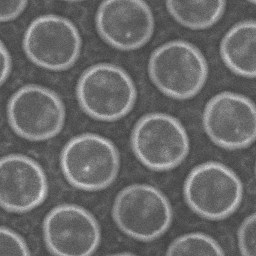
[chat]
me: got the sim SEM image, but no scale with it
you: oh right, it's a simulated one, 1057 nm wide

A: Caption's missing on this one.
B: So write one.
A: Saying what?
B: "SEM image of a regular array of raised bodies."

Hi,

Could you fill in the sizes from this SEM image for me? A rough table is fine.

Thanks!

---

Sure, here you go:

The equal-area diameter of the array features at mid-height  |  0.224 micrometres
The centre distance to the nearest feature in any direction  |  299 nanometers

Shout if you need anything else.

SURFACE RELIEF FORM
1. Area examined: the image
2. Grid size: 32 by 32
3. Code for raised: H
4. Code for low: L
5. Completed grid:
HHHLLLLLLLLLLHHHHHLLLHHHHHHHLLLL
HHLLLLLLLLLLHHHHHHHLLHHHHHHHLLLL
LLLLLHHHLLLLHHHHHHHLLLHHHHHLLLLL
LLLLHHHHHLLLHHHHHHHLLLLLLLLLLHHH
LLLHHHHHHHLLLHHHHHHLLLLLLLLLHHHH
LLLHHHHHHHLLLLHHHHLLLHHLLLLLHHHH
HLLHHHHHHHLLLLLLLLLHHHHHHLLLHHHH
HLLLHHHHHLLLLLLLLLLHHHHHHLLLHHHH
HLLLLLHHLLLLHHLLLLLHHHHHHHLLLHHH
HLLLLLLLLLHHHHHHLLLHHHHHHHLLLLLL
LLLLLLLLLLHHHHHHLLLLHHHHHLLLLLLL
LLHHHHLLLLHHHHHHHLLLLHHHLLLLLLLL
LHHHHHHLLLHHHHHHHLLLLLLLLLLHHHHL
LHHHHHHHLLLHHHHHLLLLLLLLLLHHHHHH
LHHHHHHHLLLLHHHLLLLHHLLLLLHHHHHH
LHHHHHHHLLLLLLLLLHHHHHLLLLHHHHHH
LLHHHHHLLLLLLLLLLHHHHHHLLLHHHHHH
LLLLLLLLLHHHHLLLLHHHHHHLLLLHHHHL
LLLLLLLLHHHHHHLLLHHHHHHLLLLLLLLL
LLLLLLLLHHHHHHHLLHHHHHHLLLLLLLLL
HHHHLLLLHHHHHHHLLLHHHHLLLLLLLLLL
HHHHHLLLHHHHHHLLLLLLLLLLHHHHHLLL
HHHHHHLLLHHHHHLLLLLLLLLHHHHHHHLL
HHHHHHLLLLHHLLLLHHHLLLLHHHHHHHLL
HHHHHLLLLLLLLLLHHHHHLLLHHHHHHHLL
HHHHHLLLLLLLLLLHHHHHHLLLHHHHHHLL
LLLLLLLHHHHLLLHHHHHHHLLLLHHHHLLL
LLLLLLHHHHHHLLLHHHHHHLLLLLLLLLLH
LLLLLLHHHHHHLLLHHHHHHLLLLLLLLLHH
HHLLLLHHHHHHLLLLLHHHLLLHHHLLLLHH
HHHLLLHHHHHHLLLLLLLLLLHHHHHLLLHH
HHHLLLLHHHHHLLLLLLLLLHHHHHHHLLHH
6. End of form